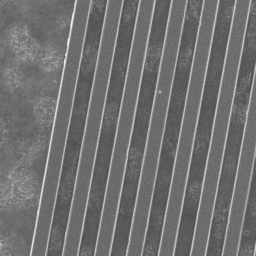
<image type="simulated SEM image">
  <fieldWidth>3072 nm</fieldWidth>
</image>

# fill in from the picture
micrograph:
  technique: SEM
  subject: parallel lines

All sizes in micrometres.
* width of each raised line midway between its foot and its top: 0.185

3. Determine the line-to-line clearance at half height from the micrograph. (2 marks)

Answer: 0.197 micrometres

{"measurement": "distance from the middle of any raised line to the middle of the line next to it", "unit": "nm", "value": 378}